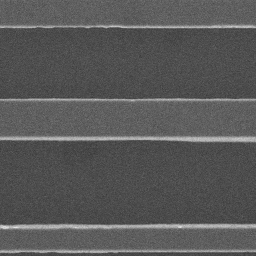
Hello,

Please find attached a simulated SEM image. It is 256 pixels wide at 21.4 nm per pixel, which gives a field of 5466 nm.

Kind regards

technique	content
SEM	lines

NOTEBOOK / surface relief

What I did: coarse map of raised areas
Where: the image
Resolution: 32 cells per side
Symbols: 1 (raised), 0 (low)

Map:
11111111111111111111111111111111
11111111111111111111111111111111
11111111111111111111111111111111
00000000000000000000000000000000
00000000000000000000000000000000
00000000000000000000000000000000
00000000000000000000000000000000
00000000000000000000000000000000
00000000000000000000000000000000
00000000000000000000000000000000
00000000000000000000000000000000
00000000000000000000000000000000
11111111111111111111111111111111
11111111111111111111111111111111
11111111111111111111111111111111
11111111111111111111111111111111
11111111111111111111111111111111
00000000000000000000000000000000
00000000000000000000000000000000
00000000000000000000000000000000
00000000000000000000000000000000
00000000000000000000000000000000
00000000000000000000000000000000
00000000000000000000000000000000
00000000000000000000000000000000
00000000000000000000000000000000
00000000000000000000000000000000
00000000000000000000000000000000
11111111111111111111111111111111
11111111111111111111111111111111
11111111111111111111111111111111
00000000000000000000000000000000